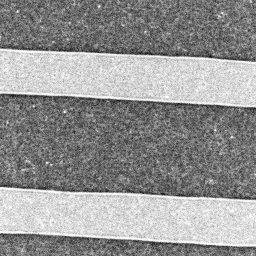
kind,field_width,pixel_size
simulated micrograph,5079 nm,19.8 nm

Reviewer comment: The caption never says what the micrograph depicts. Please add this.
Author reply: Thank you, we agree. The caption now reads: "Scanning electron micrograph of one or a few lines or trenches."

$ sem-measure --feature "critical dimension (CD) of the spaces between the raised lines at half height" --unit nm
1900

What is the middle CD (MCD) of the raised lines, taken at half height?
872 nm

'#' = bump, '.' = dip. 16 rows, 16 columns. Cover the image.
................
................
................
#########.......
################
################
.............###
................
................
................
................
................
###############.
################
################
................